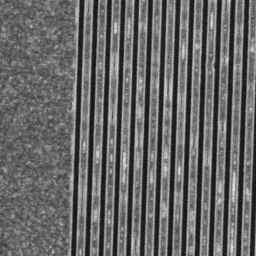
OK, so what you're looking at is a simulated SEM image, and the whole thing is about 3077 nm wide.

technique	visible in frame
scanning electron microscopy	parallel lines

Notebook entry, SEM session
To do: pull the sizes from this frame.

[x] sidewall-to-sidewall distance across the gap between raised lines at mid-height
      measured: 75 nm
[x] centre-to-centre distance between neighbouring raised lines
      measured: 165 nm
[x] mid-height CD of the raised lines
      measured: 85.6 nanometers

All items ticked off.